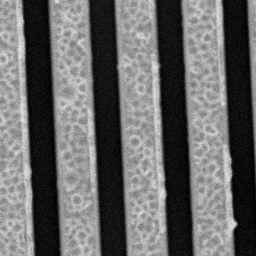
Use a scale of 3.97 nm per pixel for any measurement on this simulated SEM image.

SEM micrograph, one or a few lines or trenches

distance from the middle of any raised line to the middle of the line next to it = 265 nm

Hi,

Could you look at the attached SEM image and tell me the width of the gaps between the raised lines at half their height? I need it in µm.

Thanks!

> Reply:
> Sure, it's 0.12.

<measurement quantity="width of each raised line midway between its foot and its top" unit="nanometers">142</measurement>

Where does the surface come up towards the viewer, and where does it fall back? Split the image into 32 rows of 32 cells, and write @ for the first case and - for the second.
@@@---@@@@@----@@@@----@@@@@---@
@@@---@@@@@----@@@@----@@@@@---@
@@@---@@@@@----@@@@----@@@@@---@
@@@----@@@@----@@@@----@@@@@---@
@@@----@@@@----@@@@----@@@@@---@
@@@----@@@@----@@@@----@@@@@----
@@@----@@@@----@@@@----@@@@@----
@@@----@@@@----@@@@@---@@@@@----
@@@----@@@@----@@@@@---@@@@@----
@@@----@@@@----@@@@@----@@@@----
@@@----@@@@----@@@@@----@@@@----
@@@----@@@@----@@@@@----@@@@----
@@@----@@@@----@@@@@----@@@@----
@@@----@@@@----@@@@@----@@@@----
@@@----@@@@----@@@@@----@@@@----
@@@----@@@@@---@@@@@----@@@@----
@@@----@@@@@---@@@@@----@@@@----
@@@----@@@@@----@@@@----@@@@----
@@@----@@@@@----@@@@----@@@@----
@@@----@@@@@----@@@@----@@@@@---
@@@@---@@@@@----@@@@----@@@@@---
@@@@---@@@@@----@@@@----@@@@@---
@@@@---@@@@@----@@@@@---@@@@@---
@@@@----@@@@----@@@@@---@@@@@---
@@@@----@@@@----@@@@@---@@@@@---
@@@@----@@@@----@@@@@---@@@@@---
@@@@----@@@@----@@@@----@@@@@---
@@@@----@@@@----@@@@@---@@@@@---
@@@@----@@@@----@@@@@---@@@@@---
@@@@----@@@@----@@@@----@@@@@---
@@@@----@@@@----@@@@@----@@@@---
@@@@----@@@@----@@@@@----@@@@---